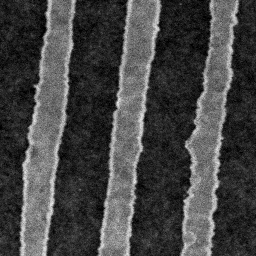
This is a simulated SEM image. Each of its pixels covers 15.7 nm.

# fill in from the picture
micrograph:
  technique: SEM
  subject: one or a few lines or trenches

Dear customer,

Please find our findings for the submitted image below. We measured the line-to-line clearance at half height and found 0.869 µm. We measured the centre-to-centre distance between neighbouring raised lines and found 1.27 um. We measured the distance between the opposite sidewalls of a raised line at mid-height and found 397 nanometers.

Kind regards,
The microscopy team